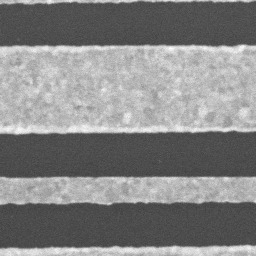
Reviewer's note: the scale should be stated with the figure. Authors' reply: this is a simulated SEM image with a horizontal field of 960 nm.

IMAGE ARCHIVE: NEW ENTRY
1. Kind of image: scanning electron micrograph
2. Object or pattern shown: lines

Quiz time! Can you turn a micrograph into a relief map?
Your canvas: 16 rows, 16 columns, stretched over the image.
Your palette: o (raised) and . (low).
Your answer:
................
................
................
oooooooooooooooo
oooooooooooooooo
oooooooooooooooo
oooooooooooooooo
oooooooooooooooo
................
................
................
oooooooooooooooo
oooooooooooooooo
................
................
..............oo